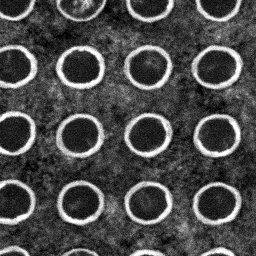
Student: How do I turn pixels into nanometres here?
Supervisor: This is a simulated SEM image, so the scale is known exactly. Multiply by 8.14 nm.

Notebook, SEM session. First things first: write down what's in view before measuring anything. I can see a regular array of raised bodies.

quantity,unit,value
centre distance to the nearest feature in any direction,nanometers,551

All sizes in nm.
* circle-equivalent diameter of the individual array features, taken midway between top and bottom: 345